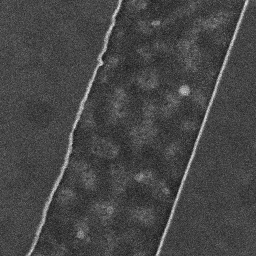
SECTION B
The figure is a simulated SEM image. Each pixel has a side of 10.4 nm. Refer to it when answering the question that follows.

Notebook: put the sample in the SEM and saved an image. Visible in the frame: one or a few lines or trenches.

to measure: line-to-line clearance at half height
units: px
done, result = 119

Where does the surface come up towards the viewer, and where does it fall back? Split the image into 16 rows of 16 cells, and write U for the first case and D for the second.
UUUUUUUDDDDDDDDU
UUUUUUUDDDDDDDDU
UUUUUUUDDDDDDDDU
UUUUUUDDDDDDDDUU
UUUUUUDDDDDDDDUU
UUUUUUDDDDDDDUUU
UUUUUDDDDDDDDUUU
UUUUUDDDDDDDDUUU
UUUUDDDDDDDDUUUU
UUUUDDDDDDDDUUUU
UUUUDDDDDDDDUUUU
UUUUDDDDDDDUUUUU
UUUDDDDDDDDUUUUU
UUUDDDDDDDDUUUUU
UUDDDDDDDDUUUUUU
UUDDDDDDDDUUUUUU